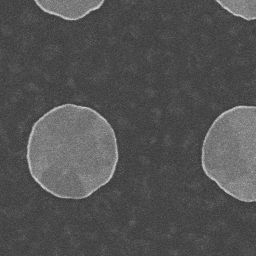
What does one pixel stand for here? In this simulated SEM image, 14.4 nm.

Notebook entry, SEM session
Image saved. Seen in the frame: raised bodies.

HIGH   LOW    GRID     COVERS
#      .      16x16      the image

...###........##
................
................
................
................
................
................
..#####.......##
..#####......###
..#####......###
..#####......###
...###........##
...............#
................
................
................